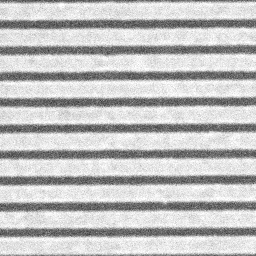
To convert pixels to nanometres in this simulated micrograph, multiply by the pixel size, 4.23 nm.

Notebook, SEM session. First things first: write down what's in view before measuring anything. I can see parallel lines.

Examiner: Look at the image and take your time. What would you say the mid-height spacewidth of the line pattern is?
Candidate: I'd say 44.4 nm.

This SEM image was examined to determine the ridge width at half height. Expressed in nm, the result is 63.5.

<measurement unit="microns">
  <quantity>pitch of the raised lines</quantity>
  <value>0.11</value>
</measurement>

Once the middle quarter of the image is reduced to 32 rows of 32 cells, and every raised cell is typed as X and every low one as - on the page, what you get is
XXXXXXXXXXXXXXXXXXXXXXXXXXXXXXXX
XXXXXXXXXX---XXXXXXXXXXXXXXX----
--------------------------------
--------------------------------
-----X-X-XXXXXXXXXX-XXXXXXXXXXXX
XXXXXXXXXXXXXXXXXXXXXXXXXXXXXXXX
XXXXXXXXXXXXXXXXXXXXXXXXXXXXXXXX
XXXXXXXXXXXXXXXXXXXXXXXXXXXXXXXX
--------------------------------
--------------------------------
--------------------------------
XXXXXXXXXXXXXXXXXXXXXXXXXXXXXXXX
XXXXXXXXXXXXXXXXXXXXXXXXXXXXXXXX
XXXXXXXXXXXXXXXXXXXXXXXXXXXXXXXX
XXXXXXXXXXXXXXXXXXXXXXXXXXXXXX-X
--------------------------------
--------------------------------
-----XXXX-----------------------
XXXXXXXXXXXXXXXXXXXXXXXXXXXXXXXX
XXXXXXXXXXXXXXXXXXXXXXXXXXXXXXXX
XXXXXXXXXXXXXXXXXXXXXXXXXXXXXXXX
--------------------------------
--------------------------------
--------------------------------
XXXXXXXXXXXXXXXXXXXXXXXXXXXXXXXX
XXXXXXXXXXXXXXXXXXXXXXXXXXXXXXXX
XXXXXXXXXXXXXXXXXXXXXXXXXXXXXXXX
XXXXXXXXXXXXXXXXXXXXXXXXXXXXXXXX
--------------------------------
--------------------------------
--------------------XXXXXXXXXXXX
XXXXXXXXXXXXXXXXXXXXXXXXXXXXXXXX